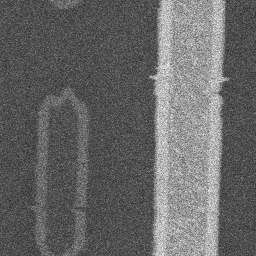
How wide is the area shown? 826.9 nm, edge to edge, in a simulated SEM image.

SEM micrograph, one or a few lines or trenches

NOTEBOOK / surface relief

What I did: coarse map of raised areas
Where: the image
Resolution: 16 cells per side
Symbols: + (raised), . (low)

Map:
..........++++..
..........++++..
..........++++..
..........++++..
..........++++..
..........+++...
...++.....+++...
...++.....+++...
...++.....+++...
...++.....+++...
...++.....+++...
...++.....+++...
...++.....+++...
...++.....+++...
...++.....+++...
...++.....+++...